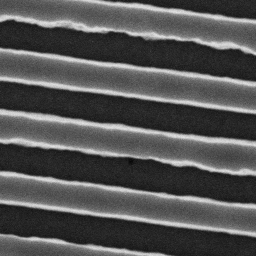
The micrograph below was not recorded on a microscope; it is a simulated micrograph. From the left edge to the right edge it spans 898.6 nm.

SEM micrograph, one or a few lines or trenches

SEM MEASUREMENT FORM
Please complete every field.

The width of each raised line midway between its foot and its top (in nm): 104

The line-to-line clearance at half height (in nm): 114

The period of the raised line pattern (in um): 0.215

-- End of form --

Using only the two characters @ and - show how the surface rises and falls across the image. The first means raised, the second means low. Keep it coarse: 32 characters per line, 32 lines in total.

@@@@@@@@@@@@@@@@----------------
@@@@@@@@@@@@@@@@@@@@@@@@--------
--@@@@@@@@@@@@@@@@@@@@@@@@@@@@@-
---------@@@@@@@@@@@@@@@@@@@@@@@
-------------------@@@@@@@@@@@@@
--------------------------@@@@@@
@@@@---------------------------@
@@@@@@@@@@----------------------
@@@@@@@@@@@@@@@@@---------------
@@@@@@@@@@@@@@@@@@@@@@@@@@------
-----@@@@@@@@@@@@@@@@@@@@@@@@@@@
-------------@@@@@@@@@@@@@@@@@@@
-------------------@@@@@@@@@@@@@
----------------------------@@@@
@@@@@---------------------------
@@@@@@@@@@@@--------------------
@@@@@@@@@@@@@@@@@@@@------------
@@@@@@@@@@@@@@@@@@@@@@@@@@@@----
-------@@@@@@@@@@@@@@@@@@@@@@@@@
---------------@@@@@@@@@@@@@@@@@
----------------------@@@@@@@@@@
----------------------------@@@@
@@@@@@@-------------------------
@@@@@@@@@@@@@@@-----------------
@@@@@@@@@@@@@@@@@@@@@-----------
---@@@@@@@@@@@@@@@@@@@@@@@@@----
---------@@@@@@@@@@@@@@@@@@@@@@@
-----------------@@@@@@@@@@@@@@@
-------------------------@@@@@@@
@@------------------------------
@@@@@@@@@-----------------------
@@@@@@@@@@@@@@@@----------------